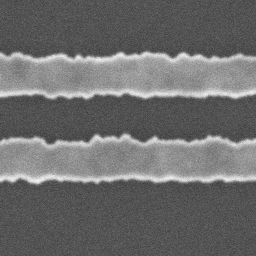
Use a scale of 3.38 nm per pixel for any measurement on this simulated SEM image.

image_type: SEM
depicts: lines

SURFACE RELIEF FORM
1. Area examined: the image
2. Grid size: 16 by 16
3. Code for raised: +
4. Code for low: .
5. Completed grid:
................
................
................
++.+...+++.+...+
++++++++++++++++
++++++++++++++++
................
................
................
++++++++++++++++
++++++++++++++++
................
................
................
................
................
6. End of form